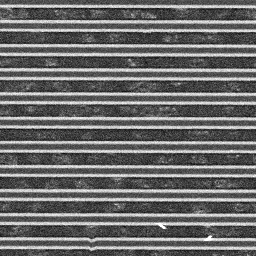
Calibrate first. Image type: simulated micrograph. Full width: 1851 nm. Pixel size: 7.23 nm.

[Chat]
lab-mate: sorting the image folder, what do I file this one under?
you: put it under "parallel lines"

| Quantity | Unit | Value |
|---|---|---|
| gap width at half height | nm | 110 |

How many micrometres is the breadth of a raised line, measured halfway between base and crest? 0.0687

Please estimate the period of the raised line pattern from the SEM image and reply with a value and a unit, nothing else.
24.2 pixels